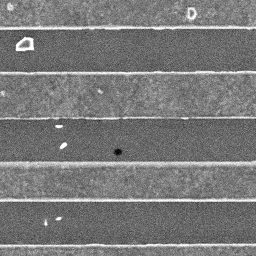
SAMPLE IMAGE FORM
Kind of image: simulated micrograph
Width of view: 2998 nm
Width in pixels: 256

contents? lines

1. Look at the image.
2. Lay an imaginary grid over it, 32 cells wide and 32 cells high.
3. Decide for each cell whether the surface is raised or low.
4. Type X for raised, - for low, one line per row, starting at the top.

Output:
XXXXXXXXXXXXXXXXXXXXXXXXXXXXXXXX
XXXXXXXXXXXXXXXXXXXXXXXXXXXXXXXX
XXXXXXXXXXXXXXXXXXXXXXXXXXXXXXXX
X-------------------------------
--------------------------------
--XX----------------------------
--------------------------------
--------------------------------
--------------------------------
XXXXXXXXXXXXXXXXXXXXXXXXXXXXXXXX
XXXXXXXXXXXXXXXXXXXXXXXXXXXXXXXX
XXXXXXXXXXXXXXXXXXXXXXXXXXXXXXXX
XXXXXXXXXXXXXXXXXXXXXXXXXXXXXXXX
XXXXXXXXXXXXXXXXXXXXXXXXXXXXXXXX
XXXXXXXXXXXXXXXXXXXXXXXXXXXXXXXX
--------------------------------
--------------------------------
--------------------------------
--------------------------------
--------------------------------
--------------------------XXXXXX
XXXXXXXXXXXXXXXXXXXXXXXXXXXXXXXX
XXXXXXXXXXXXXXXXXXXXXXXXXXXXXXXX
XXXXXXXXXXXXXXXXXXXXXXXXXXXXXXXX
XXXXXXXXXXXXXXXXXXXXXXXXXXXXXXXX
--------------------------------
--------------------------------
--------------------------------
--------------------------------
--------------------------------
--------------------------------
XXXXXXXXXXXXXXXXXXXXXXXXXXXXXXXX